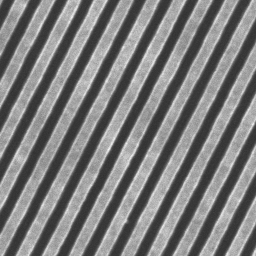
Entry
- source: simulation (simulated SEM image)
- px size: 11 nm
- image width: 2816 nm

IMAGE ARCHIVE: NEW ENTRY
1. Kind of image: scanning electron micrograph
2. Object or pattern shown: parallel lines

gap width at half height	119	nm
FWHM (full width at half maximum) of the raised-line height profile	141	nm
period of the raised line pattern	257	nm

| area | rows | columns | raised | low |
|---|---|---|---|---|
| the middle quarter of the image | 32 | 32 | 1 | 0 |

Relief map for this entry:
11100011100011110001110001111000
11000111100011100011110001110001
11000111000111100011100011110001
10001111000111000111100011100011
00001110001111000111000111100011
00011110001110001111000111000111
00011100011110001110001111000111
00111000011100011110001110001111
01111000111100011100011100001110
01110000111000111100011100011110
11110001111000111000111100011100
11100011110001111000111000111100
11100011110001110001111000111000
11000011100011110011110001111000
11000111000011100011110001110001
10000111000111100111100011110001
10001110001111000111100011100011
00001110001111001111000111100011
00011100011110001111000111000111
00111100011110011110001110000111
00111000111100011110001110001111
01111000111000111100011100001110
01110000111000111100011100011110
11110001110001111000111000011100
11100001110001111001111000111100
11100011100011110001111000111000
11000111100011110011110001111000
11000111000111100011110001110001
10001111000111000111100011110001
10001110001111000111100011100011
00011110001110001111000111000011
00011100011110001111000111000111